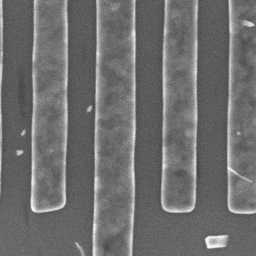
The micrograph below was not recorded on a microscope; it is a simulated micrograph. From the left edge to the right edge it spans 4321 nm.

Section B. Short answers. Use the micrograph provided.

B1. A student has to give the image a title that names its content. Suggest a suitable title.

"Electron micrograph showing wiring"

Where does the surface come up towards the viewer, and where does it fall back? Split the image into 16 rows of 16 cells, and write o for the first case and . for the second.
..oo..oo..oo..oo
..oo..oo..oo..oo
..oo..oo..oo..oo
..oo..oo..oo..oo
..oo..oo..oo..oo
..oo..oo..oo..oo
..oo..oo..oo..oo
..oo..oo..oo..oo
..oo..oo..oo..oo
..oo..oo..oo..oo
..oo..oo..oo..oo
..oo..oo..oo..oo
..oo..oo..oo..oo
......oo........
......oo........
......oo........